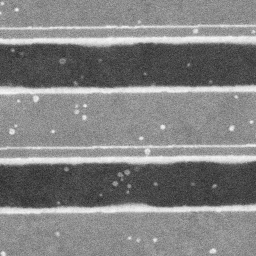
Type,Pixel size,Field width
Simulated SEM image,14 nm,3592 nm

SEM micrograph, lines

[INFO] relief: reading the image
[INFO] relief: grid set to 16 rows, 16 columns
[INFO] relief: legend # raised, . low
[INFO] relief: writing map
################
################
#...............
................
................
................
################
################
################
################
................
................
................
################
################
################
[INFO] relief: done